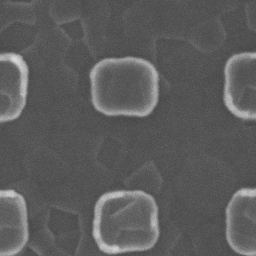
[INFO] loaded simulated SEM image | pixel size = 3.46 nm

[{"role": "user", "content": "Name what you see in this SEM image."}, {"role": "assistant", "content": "raised bodies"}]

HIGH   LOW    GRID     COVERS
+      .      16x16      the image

................
................
................
+..............+
++....++++....++
++....++++....++
+.....++++....++
................
................
................
................
................
+.....++++....++
++....++++....++
++....++++....++
+.....+++......+